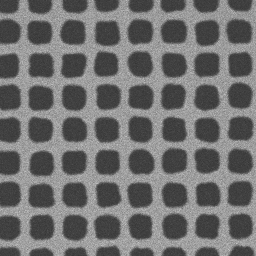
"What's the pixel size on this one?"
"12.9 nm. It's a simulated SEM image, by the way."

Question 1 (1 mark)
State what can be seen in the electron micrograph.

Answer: a regular array of holes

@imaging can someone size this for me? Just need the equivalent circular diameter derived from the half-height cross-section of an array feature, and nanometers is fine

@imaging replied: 337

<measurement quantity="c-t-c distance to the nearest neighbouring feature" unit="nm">412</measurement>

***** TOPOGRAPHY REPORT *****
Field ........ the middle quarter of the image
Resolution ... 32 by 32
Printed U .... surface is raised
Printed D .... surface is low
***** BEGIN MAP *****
DDDDDDUUDDDDDDUUDDDDDDUUDDDDDDDU
DDDDDUUUDDDDDDUUDDDDDDUUUDDDDDDU
DDDDDUUUDDDDDUUUUDDDDDUUUDDDDDUU
UDUUUUUUUUUUUUUUUUUUUUUUUUUUUUUU
UUUUUUUUUUUUUUUUUUUUUUUUUUUUUUUU
DDDDUUUUDDDDDUUUUUDDDUUUUDDDDDUU
DDDDDUUUDDDDDDUUDDDDDDUUDDDDDDUU
DDDDDDUUDDDDDDUUDDDDDDUUDDDDDDDU
DDDDDDUUDDDDDDUUDDDDDDUUDDDDDDUU
DDDDDDUUDDDDDDUUDDDDDDUUDDDDDDUU
DDDDDUUUDDDDDUUUDDDDDDUUUDDDDDUU
UDDDUUUUUUDUUUUUUUUUDUUUUUDUUUUU
UUUUUUUUUUUUUUUUUUUUUUUUUUUUUUUU
UDDDUUUUUDDDUUUUUDDDUUUUUUDDDUUU
DDDDDUUUDDDDDDUUDDDDDDUUUDDDDDUU
DDDDDDUUDDDDDDUUDDDDDDUUUDDDDDUU
DDDDDDUUDDDDDDUUDDDDDDUUUDDDDDDU
DDDDDDUUDDDDDDUUDDDDDDUUDDDDDDDU
DDDDDDUUDDDDDUUUUDDDDDUUUDDDDDDU
UUUUUUUUUDDDUUUUUUDDDUUUUUUDDUUU
UUUUUUUUUUUUUUUUUUUUUUUUUUUUUUUU
UUUUUUUUUDDUUUUUUDDDDUUUUUDDDDUU
DDDDDUUUDDDDDDUUUDDDDDUUUDDDDDDU
DDDDDDUUDDDDDDUUDDDDDDUUDDDDDDDU
DDDDDDUUDDDDDDUUDDDDDDDUDDDDDDDU
DDDDDDUUDDDDDDUUDDDDDDDUUDDDDDDU
DDDDDUUUDDDDDDUUUDDDDDUUUDDDDDUU
UDDDUUUUUDDDUUUUUDDDDUUUUUUUUUUU
UUUUUUUUUUUUUUUUUUUUUUUUUUUUUUUU
UUDUUUUUUUDUUUUUUUUUUUUUUUUUUUUU
DDDDDUUUDDDDDUUUDDDDDDUUUDDDDDUU
DDDDDDUUDDDDDDUUDDDDDDUUUDDDDDDU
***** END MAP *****